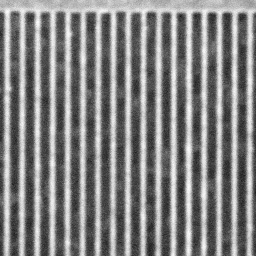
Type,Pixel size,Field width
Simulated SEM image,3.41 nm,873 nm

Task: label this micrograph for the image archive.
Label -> parallel lines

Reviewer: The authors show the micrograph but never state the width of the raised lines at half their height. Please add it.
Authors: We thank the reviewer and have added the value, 12.4 nm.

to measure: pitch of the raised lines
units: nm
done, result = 51.8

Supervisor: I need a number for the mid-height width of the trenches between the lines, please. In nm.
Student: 39.7